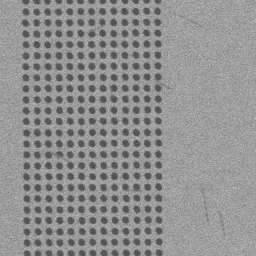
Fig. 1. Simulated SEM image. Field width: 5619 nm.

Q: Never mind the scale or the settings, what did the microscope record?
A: a regular array of holes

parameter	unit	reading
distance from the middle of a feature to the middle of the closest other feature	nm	235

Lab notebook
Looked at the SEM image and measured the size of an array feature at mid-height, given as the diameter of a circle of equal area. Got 160 nanometres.